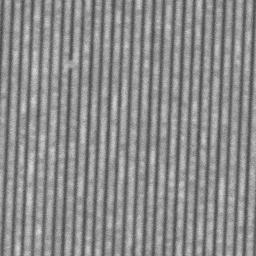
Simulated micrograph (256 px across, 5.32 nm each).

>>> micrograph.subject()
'parallel lines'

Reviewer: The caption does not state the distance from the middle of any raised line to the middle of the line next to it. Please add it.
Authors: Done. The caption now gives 53.6 nanometres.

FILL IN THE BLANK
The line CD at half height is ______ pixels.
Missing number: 6.86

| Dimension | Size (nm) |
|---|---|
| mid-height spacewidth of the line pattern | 17.9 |